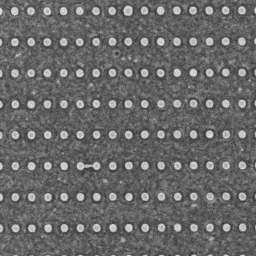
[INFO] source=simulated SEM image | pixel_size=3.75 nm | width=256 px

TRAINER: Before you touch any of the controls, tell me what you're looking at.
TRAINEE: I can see a regular array of raised bodies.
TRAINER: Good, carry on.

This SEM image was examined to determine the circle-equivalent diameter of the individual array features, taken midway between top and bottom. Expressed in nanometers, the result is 28.4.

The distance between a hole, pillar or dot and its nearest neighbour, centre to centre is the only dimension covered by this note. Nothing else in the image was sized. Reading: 60.3 nm